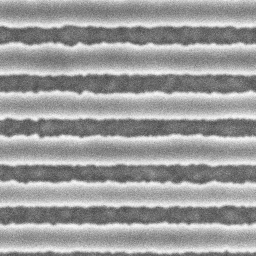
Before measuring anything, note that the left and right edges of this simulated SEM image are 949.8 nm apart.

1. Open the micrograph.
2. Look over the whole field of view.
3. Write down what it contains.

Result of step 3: lines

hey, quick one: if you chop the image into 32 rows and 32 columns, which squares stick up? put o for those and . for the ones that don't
oooooooooooooooooooooooooooooooo
oooooooooooooooooooooooooooooooo
oooooooooooooooooooooooooooooooo
................................
................................
.oo...o.......o.................
oooooooooooooooooooooooooooooooo
oooooooooooooooooooooooooooooooo
oooooooooooooooooooooooooooooooo
................................
................................
.....o.oo.......................
oooooooooooooooooooooooooooooooo
oooooooooooooooooooooooooooooooo
oooooooooooooooooooooooooooooooo
................................
................................
oooooooooooooooooooooooooooooooo
oooooooooooooooooooooooooooooooo
oooooooooooooooooooooooooooooooo
.ooo.oo..oo.ooooooooo.oo..oooo.o
................................
................................
oooooooooooooooooooooooooooooooo
oooooooooooooooooooooooooooooooo
oooooooooooooooooooooooooooooooo
................................
................................
oooooooooooooooooooooooooooooooo
oooooooooooooooooooooooooooooooo
oooooooooooooooooooooooooooooooo
................o...oo..........